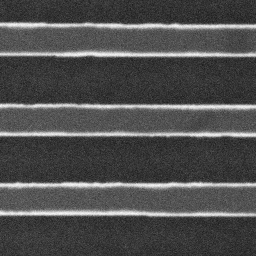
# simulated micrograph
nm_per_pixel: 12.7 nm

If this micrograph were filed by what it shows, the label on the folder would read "lines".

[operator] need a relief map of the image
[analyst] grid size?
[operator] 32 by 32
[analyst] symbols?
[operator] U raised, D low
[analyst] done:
DDDDDDDDDDDDDDDDDDDDDDDDDDDDDDDD
DDDDDDDDDDDDDDDDDDDDDDDDDDDDDDDD
DDDDDDDDDDDDDDDDDDDDDDDDDDDDDDDD
UUUUUUUUUUUUUUUUUUUUUUUUUUUUUUUU
UUUUUUUUUUUUUUUUUUUUUUUUUUUUUUUU
UUUUUUUUUUUUUUUUUUUUUUUUUUUUUUUU
UUUUUUUUUUUUUUUUUUUUUUUUUUUUUUUU
DDDDDDDDDDDDDDDDDDDDDDDDDDDDDDDD
DDDDDDDDDDDDDDDDDDDDDDDDDDDDDDDD
DDDDDDDDDDDDDDDDDDDDDDDDDDDDDDDD
DDDDDDDDDDDDDDDDDDDDDDDDDDDDDDDD
DDDDDDDDDDDDDDDDDDDDDDDDDDDDDDDD
DDDDDDDDDDDDDDDDDDDDDDDDDDDDDDDD
UUUUUUUUUUUUUUUUUUUUUUUUUUUUUUUU
UUUUUUUUUUUUUUUUUUUUUUUUUUUUUUUU
UUUUUUUUUUUUUUUUUUUUUUUUUUUUUUUU
UUUUUUUUUUUUUUUUUUUUUUUUUUUUUUUU
DDDDDDDDDDDDDDDDDDDDDDDDDDDDDDDD
DDDDDDDDDDDDDDDDDDDDDDDDDDDDDDDD
DDDDDDDDDDDDDDDDDDDDDDDDDDDDDDDD
DDDDDDDDDDDDDDDDDDDDDDDDDDDDDDDD
DDDDDDDDDDDDDDDDDDDDDDDDDDDDDDDD
DDDDDDDDDDDDDDDDDDDDDDDDDDDDDDDD
UUUUUUUUUUUUUUUUUUUUUUUUUUUUUUUU
UUUUUUUUUUUUUUUUUUUUUUUUUUUUUUUU
UUUUUUUUUUUUUUUUUUUUUUUUUUUUUUUU
UUUUUUUUUUUUUUUUUUUUUUUUUUUUUUUU
DDDDDDDDDDDDDDDDDDDDDDDDDDDDDDDD
DDDDDDDDDDDDDDDDDDDDDDDDDDDDDDDD
DDDDDDDDDDDDDDDDDDDDDDDDDDDDDDDD
DDDDDDDDDDDDDDDDDDDDDDDDDDDDDDDD
DDDDDDDDDDDDDDDDDDDDDDDDDDDDDDDD